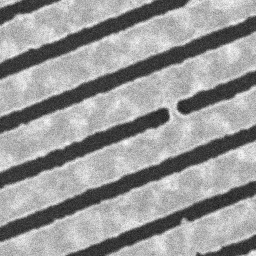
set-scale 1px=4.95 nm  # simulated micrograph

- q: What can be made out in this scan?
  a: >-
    parallel lines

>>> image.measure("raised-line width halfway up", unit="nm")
164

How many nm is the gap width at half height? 86.9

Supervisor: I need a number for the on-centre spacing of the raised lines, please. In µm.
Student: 0.252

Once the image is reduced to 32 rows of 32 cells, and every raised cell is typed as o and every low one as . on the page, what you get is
o......ooooooooooo.....ooooooooo
....ooooooooooo......ooooooooooo
..ooooooooooo......ooooooooooo..
oooooooooo.......ooooooooooo....
oooooooo......ooooooooooo......o
ooooo......oooooooooooo......ooo
ooo......ooooooooooo......oooooo
......ooooooooooo.......oooooooo
....ooooooooooo......ooooooooooo
.ooooooooooo.......ooooooooooo..
oooooooooo......ooooooooooo.....
oooooooo......ooooooooooo......o
ooooo......ooooooooooo.......ooo
ooo......ooooooooooo.o....oooooo
......ooooooooooo....ooooooooooo
....ooooooooooo......ooooooooooo
.ooooooooooo......ooooooooooo...
oooooooooo......oooooooooo......
ooooooo......ooooooooooo......oo
ooooo......ooooooooooo......oooo
oo......ooooooooooo......ooooooo
......ooooooooooo......ooooooooo
...ooooooooooo......ooooooooooo.
.oooooooooo.......ooooooooooo...
ooooooooo......ooooooooooo......
ooooooo......ooooooooooo.....ooo
oooo......ooooooooooo......ooooo
oo......ooooooooooo......ooooooo
.....ooooooooooo......oooooooooo
...ooooooooooo......ooooooooooo.
oooooooooooo.....ooooooooooo....
ooooooooo......ooooooooooo......